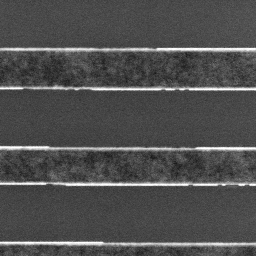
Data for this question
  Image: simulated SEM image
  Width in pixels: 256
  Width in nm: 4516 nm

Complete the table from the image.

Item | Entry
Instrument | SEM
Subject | lines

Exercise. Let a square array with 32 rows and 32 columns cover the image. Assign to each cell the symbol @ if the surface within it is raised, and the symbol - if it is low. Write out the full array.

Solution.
--------------------------------
--------------------------------
--------------------------------
--------------------------------
--------------------------------
--------------------------------
@@@@@@@@@@@@@@@@@@@@@@@@@@@@@@@@
@@@@@@@@@@@@@@@@@@@@@@@@@@@@@@@@
@@@@@@@@@@@@@@@@@@@@@@@@@@@@@@@@
@@@@@@@@@@@@@@@@@@@@@@@@@@@@@@@@
@@@@@@@@@@@@@@@@@@@@@@@@@@@@@@@@
--------------------------------
--------------------------------
--------------------------------
--------------------------------
--------------------------------
--------------------------------
--------------------------------
--------------------------------
@@@@@@@@@@@@@@@@@@@@@@@@@@@@@@@@
@@@@@@@@@@@@@@@@@@@@@@@@@@@@@@@@
@@@@@@@@@@@@@@@@@@@@@@@@@@@@@@@@
@@@@@@@@@@@@@@@@@@@@@@@@@@@@@@@@
--------------------------------
--------------------------------
--------------------------------
--------------------------------
--------------------------------
--------------------------------
--------------------------------
@@@@@@@@@@@@@-------------------
@@@@@@@@@@@@@@@@@@@@@@@@@@@@@@@@